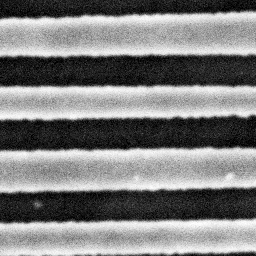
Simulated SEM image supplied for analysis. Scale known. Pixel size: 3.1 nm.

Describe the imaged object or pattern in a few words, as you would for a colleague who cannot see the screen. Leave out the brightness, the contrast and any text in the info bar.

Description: lines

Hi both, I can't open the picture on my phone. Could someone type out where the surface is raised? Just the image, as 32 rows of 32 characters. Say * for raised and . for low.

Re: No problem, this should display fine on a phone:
................................
................................
********************************
********************************
********************************
********************************
********************************
................................
................................
................................
................................
********************************
********************************
********************************
***************************...*.
................................
................................
................................
................................
********************************
********************************
********************************
********************************
***********************.........
................................
................................
................................
................................
********************************
********************************
********************************
************************.*......